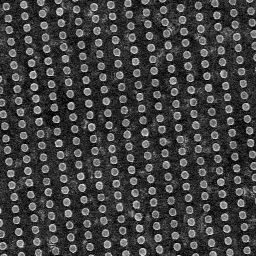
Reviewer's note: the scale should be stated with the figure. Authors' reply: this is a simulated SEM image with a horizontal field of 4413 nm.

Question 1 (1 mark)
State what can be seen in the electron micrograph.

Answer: a regular array of raised bodies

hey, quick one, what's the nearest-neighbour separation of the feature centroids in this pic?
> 201 nanometres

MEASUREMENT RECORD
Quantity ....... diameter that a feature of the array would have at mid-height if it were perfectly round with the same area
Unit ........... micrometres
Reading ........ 0.123